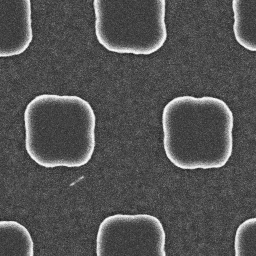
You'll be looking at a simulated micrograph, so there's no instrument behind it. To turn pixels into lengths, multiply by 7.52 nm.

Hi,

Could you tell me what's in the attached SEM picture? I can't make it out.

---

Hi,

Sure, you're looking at raised bodies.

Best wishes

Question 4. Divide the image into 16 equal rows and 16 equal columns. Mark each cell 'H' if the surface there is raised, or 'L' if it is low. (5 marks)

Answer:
HHLLLLHHHHLLLLLH
HHLLLLHHHHLLLLLH
HHLLLLHHHHLLLLLH
LLLLLLLLLLLLLLLL
LLLLLLLLLLLLLLLL
LLLLLLLLLLLLLLLL
LLHHHLLLLLLHHHLL
LLHHHHLLLLHHHHLL
LLHHHHLLLLHHHHLL
LLHHHHLLLLHHHHLL
LLLLLLLLLLLLLLLL
LLLLLLLLLLLLLLLL
LLLLLLLLLLLLLLLL
LLLLLLLHHLLLLLLL
HHLLLLHHHHLLLLLH
HHLLLLHHHHLLLLLH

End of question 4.